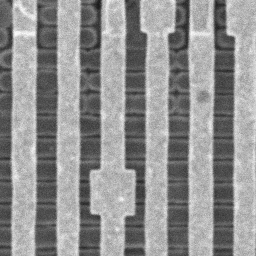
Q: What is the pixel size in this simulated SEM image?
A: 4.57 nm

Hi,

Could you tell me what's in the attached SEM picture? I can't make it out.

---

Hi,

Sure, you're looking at wiring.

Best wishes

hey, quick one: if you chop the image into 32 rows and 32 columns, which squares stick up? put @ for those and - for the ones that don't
--@@---@@@---@@---@@@@--@@@-@@@@
--@@@--@@@---@@@--@@@@--@@@-@@@@
--@@@--@@@---@@@--@@@@--@@@-@@@@
--@@---@@@---@@@--@@@@--@@@-@@@@
--@@---@@@---@@@--@@@---@@@--@@@
--@@---@@@---@@@--@@@---@@@--@@@
--@@---@@@---@@@--@@@---@@@--@@@
--@@---@@@---@@@--@@@---@@@--@@@
--@@---@@@---@@@--@@@---@@@--@@@
--@@---@@@---@@@--@@@---@@@--@@@
--@@---@@@---@@@--@@@---@@@--@@@
--@@---@@@---@@---@@@---@@@--@@@
--@@---@@@---@@---@@@---@@@--@@@
--@@---@@@---@@---@@@---@@@--@@@
--@@---@@@---@@---@@@---@@@--@@@
--@@---@@@---@@---@@@---@@---@@@
--@@---@@@---@@---@@@---@@---@@@
--@@---@@@---@@---@@@---@@---@@@
--@@---@@@---@@---@@@---@@---@@@
--@@---@@@---@@---@@@---@@---@@@
--@@---@@@---@@---@@@---@@---@@@
--@@---@@@--@@@@@-@@@---@@---@@@
--@@---@@@-@@@@@@-@@@---@@@--@@@
--@@---@@@-@@@@@@-@@@---@@@--@@@
--@@---@@@-@@@@@@-@@@---@@@--@@@
--@@---@@@-@@@@@@-@@@---@@@--@@@
--@@---@@@--@@@@@-@@@---@@@--@@@
--@@---@@@---@@@--@@@---@@@--@@@
--@@---@@@---@@---@@@---@@@--@@@
--@@---@@@---@@---@@@---@@---@@@
--@@---@@@---@@---@@@---@@---@@@
--@@---@@@---@@---@@@---@@---@@@